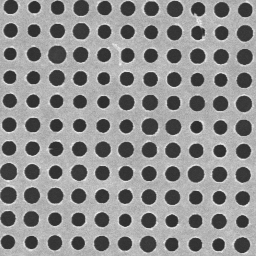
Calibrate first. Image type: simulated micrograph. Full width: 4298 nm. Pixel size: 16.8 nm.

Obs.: a regular array of holes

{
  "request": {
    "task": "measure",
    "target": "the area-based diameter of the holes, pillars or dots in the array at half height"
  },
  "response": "14.8 px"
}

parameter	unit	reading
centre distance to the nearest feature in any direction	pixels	23.3